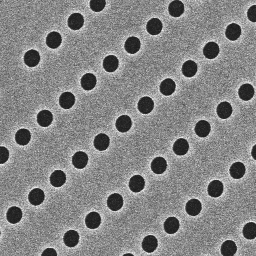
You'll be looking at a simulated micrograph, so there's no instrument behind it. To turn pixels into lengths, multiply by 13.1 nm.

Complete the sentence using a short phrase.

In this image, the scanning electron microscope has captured a regular array of holes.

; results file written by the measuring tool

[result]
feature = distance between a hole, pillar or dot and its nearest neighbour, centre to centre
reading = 373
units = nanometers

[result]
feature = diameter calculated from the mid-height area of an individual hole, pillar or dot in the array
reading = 226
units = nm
